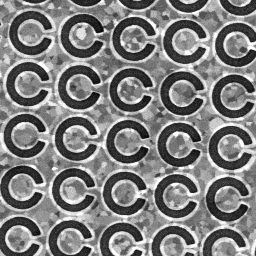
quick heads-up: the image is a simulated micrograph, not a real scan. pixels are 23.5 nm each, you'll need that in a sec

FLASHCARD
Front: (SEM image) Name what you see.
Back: an array of small figures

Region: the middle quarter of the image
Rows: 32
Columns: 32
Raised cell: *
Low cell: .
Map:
*.....************************.*
........******......*********..*
.........****........******.....
..****...***..........***.......
.******..***...****...**....**..
.**********...******..**...*****
.**********...**********...*****
.******..**...**********...*****
..****...**...*****...**...*****
........****....**....**...*****
........*****........****....*..
**....********.....*******......
***************************.....
*.....**************************
.......******......*********..**
........****........*****.......
.****...***....**....***........
******...**...****...***....**..
**********...******..**....*****
**********...**********...******
.*****...*...**********...******
..**....**....*****..**...******
........***....**....***...****.
.......*****........****........
***.*********......******.......
***************************.....
......*********.****************
.......*****......*********...**
..*....****........******.......
*****...**....**....****........
*****...**...*****...**....***..
**********...*****...**...*****.